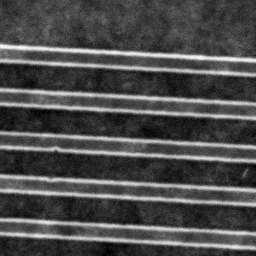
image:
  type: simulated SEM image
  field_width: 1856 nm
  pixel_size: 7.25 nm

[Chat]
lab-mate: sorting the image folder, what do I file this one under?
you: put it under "parallel lines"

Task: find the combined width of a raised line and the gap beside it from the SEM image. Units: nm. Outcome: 313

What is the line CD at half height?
0.108 microns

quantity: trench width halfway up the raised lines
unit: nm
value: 204